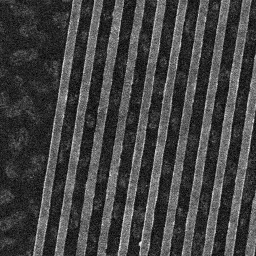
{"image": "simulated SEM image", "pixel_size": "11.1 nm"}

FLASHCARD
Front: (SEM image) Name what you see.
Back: parallel lines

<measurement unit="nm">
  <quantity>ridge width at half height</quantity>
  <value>94.2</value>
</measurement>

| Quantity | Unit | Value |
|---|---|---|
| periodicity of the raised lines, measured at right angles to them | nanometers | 231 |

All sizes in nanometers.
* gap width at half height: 138